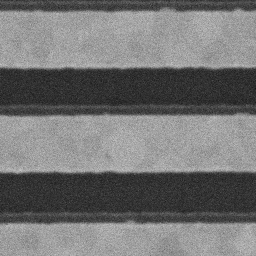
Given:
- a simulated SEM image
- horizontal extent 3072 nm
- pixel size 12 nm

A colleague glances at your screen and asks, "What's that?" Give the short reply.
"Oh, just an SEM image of lines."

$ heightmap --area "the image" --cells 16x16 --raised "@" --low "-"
----------------
@@@@@@@@@@@@@@@@
@@@@@@@@@@@@@@@@
@@@@@@@@@@@@@@@@
----------------
----------------
----------------
@@@@@@@@@@@@@@@@
@@@@@@@@@@@@@@@@
@@@@@@@@@@@@@@@@
@@@@@@@@@@@@@@@@
----------------
----------------
----------------
@@@@@@@@@@@@@@@@
@@@@@@@@@@@@@@@@